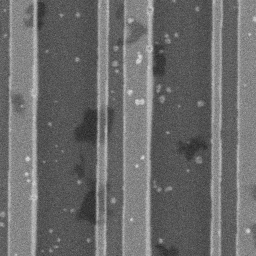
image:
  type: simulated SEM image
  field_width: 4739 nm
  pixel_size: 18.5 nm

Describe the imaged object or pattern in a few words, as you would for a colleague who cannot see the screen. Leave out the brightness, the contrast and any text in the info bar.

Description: lines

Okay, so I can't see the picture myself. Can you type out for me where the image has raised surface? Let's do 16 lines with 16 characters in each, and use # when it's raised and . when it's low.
##....###....###
##....###....###
##....###....###
##....###....###
##....###....###
##....###....###
##....###....###
##....###....###
##....###....###
##....###....###
##....###....###
##....###....###
##....###....###
##....###....###
##....###....###
##....###....###